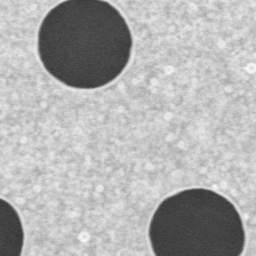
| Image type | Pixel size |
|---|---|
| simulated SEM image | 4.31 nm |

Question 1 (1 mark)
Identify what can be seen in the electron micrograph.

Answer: holes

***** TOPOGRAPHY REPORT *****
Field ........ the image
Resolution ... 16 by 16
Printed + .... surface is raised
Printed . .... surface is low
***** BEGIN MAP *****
+++....+++++++++
+++.....++++++++
++......++++++++
++......++++++++
+++.....++++++++
+++++.++++++++++
++++++++++++++++
++++++++++++++++
++++++++++++++++
++++++++++++++++
++++++++++++++++
++++++++++++++++
++++++++++....++
.+++++++++.....+
.++++++++......+
.++++++++......+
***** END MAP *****